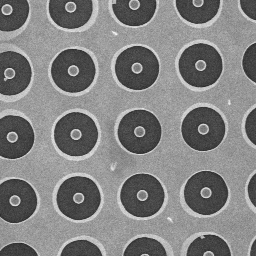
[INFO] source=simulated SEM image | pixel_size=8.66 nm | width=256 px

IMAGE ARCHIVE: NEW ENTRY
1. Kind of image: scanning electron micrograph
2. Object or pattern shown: an array of small figures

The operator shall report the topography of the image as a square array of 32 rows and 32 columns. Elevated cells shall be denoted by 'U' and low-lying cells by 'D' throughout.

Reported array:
DDDDUUDDUDDDUUDDUDDDUUDDUDDDUUDD
UDDDUUDDDDDDUUDDDDDUUUDDDDDUUUDD
DDDUUUDDDDDDUUUDDDDUUUUDDDDUUUUU
DDDUUUUUDDUUUUUUUUUUUUUUUUUUUUUU
UUUUUUUUUUUUUUUUUUUUUUUUUUUUUUUU
UUUUUUUUUUUUUUUUUUUUUUUUDDUUUUUU
DDDUUUUUDDDUUUUDDDDUUUUDDDDUUUUD
DDDDUUUDDDDDUUDDDDDDUUDDDDDDUUDD
DDDDUUDDDUDDUUDDDUDDUUDDDUDDUUDD
DUDDUUDDDDDDUUDDDDDDUUDDDDDDUUUD
DDDDUUUDDDDDUUUDDDDUUUUDDDDUUUUU
DDDUUUUUDDUUUUUUUUUUUUUUUUUUUUUU
UUUUUUUUUUUUUUUUUUUUUUUUUUUUUUUU
UUUUUUUUUUUUUUUUUUUUUUUUDDDUUUUU
DDDUUUUUDDDUUUUDDDDUUUUDDDDDUUUD
DDDDUUUDDDDDUUUDDDDDUUUDDDDDUUDD
DDDDUUUDDUDDUUDDDUDDUUUDDUDDUUDD
DUDDUUUDDDDDUUUDDDDDUUUDDDDDUUUD
DDDDUUUDDDDDUUUDDDDUUUUUDDDUUUUU
DDDUUUUUDDDUUUUUUUUUUUUUUUUUUUUU
UUUUUUUUUUUUUUUUUUUUUUUUUUUUUUUU
UUUUUUUUUUUUUUUUUUUUUUUUUDDUUUUU
UDDUUUUUDDDDUUUUDDDDUUUDDDDDUUUD
DDDDUUUDDDDDUUUDDDDDUUUDDDDDUUUD
DDDDDUUDDUDDDUUDDUDDDUUDDUDDDUUD
DDDDDUUDDDDDDUUDDDDDDUUDDDDDUUUD
DDDDUUUDDDDDUUUUDDDDUUUUDDDUUUUU
UDDUUUUUUDDUUUUUUUUUUUUUUUUUUUUU
UUUUUUUUUUUUUUUUUUUUUUUUUUUUUUUU
UUUUUUUUUUUUUUUUUUDUUUUUUDDUUUUU
UDDUUUUUDDDDUUUUDDDDDUUDDDDDUUUD
DDDDDUUUDDDDDUUDDDDDDUUDDDDDDUUD